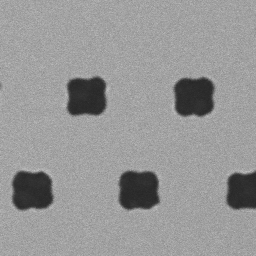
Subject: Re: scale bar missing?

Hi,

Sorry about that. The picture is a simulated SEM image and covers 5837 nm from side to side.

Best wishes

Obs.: holes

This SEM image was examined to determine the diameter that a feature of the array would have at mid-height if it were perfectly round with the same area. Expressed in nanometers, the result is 973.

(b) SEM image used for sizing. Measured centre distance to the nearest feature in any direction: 107 pixels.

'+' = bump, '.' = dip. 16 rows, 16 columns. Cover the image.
++++++++++++++++
++++++++++++++++
++++++++++++++++
++++++++++++++++
++++++++++++++++
++++...++++..+++
++++...++++..+++
++++++++++++++++
++++++++++++++++
++++++++++++++++
++++++++++++++++
+..++++...++++..
+..++++...++++..
++++++++++++++++
++++++++++++++++
++++++++++++++++